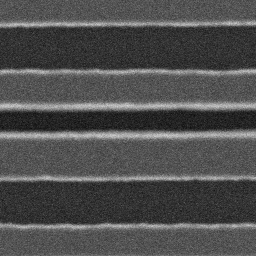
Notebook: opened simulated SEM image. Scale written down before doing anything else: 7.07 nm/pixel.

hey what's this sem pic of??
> lines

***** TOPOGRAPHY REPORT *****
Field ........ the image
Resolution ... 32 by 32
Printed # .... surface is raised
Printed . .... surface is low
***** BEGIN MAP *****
################################
################################
################################
................................
................................
................................
................................
................................
................................
################################
################################
################################
################################
................................
................................
................................
................................
################################
################################
################################
################################
################################
............#...................
................................
................................
................................
................................
................................
################################
################################
################################
################################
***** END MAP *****